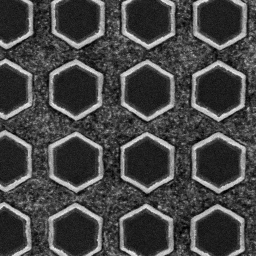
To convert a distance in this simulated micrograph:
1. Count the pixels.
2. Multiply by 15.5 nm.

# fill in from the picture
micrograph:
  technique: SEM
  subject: raised bodies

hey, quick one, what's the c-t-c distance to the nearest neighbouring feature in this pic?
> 1110 nanometers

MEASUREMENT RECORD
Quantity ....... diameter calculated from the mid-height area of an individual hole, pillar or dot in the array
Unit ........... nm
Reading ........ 810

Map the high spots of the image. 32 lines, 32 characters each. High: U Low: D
UUUUDDDUUUUUUDDDUUUUUDDDDUUUUUDD
UUUUDDDUUUUUUDDUUUUUUUDDUUUUUUUD
UUUUDDDUUUUUUDDDUUUUUUDDUUUUUUUD
UUUUDDDUUUUUUDDDUUUUUUDDUUUUUUUD
UUUDDDDUUUUUDDDDUUUUUDDDDUUUUUDD
UUDDDDDDDUDDDDDDDDUDDDDDDDUUUDDD
DDDDDDDDDDDDDDDDDDDDDDDDDDDDDDDD
DDDDDDDDDDDDDDDDDDDDDDDDDDDDDDDD
UUDDDDDDUUUDDDDDDUUUDDDDDDUUUDDD
UUUUDDUUUUUUDDDUUUUUUDDDUUUUUUDD
UUUUDDUUUUUUDDDUUUUUUUDDUUUUUUDD
UUUUDDUUUUUUDDDUUUUUUUDDUUUUUUDD
UUUUDDUUUUUUDDDUUUUUUUDDUUUUUUDD
UUUDDDDUUUUUDDDDUUUUUDDDDUUUUUDD
UDDDDDDDDUDDDDDDDDUDDDDDDDDUDDDD
DDDDDDDDDDDDDDDDDDDDDDDDDDDDDDDD
DDDDDDDDDDDDDDDDDDDDDDDDDDDDDDDD
UUDDDDDDUUUDDDDDDUUUDDDDDDUUUDDD
UUUUDDUUUUUUDDDUUUUUUDDDUUUUUUDD
UUUUDDUUUUUUUDDUUUUUUDDDUUUUUUDD
UUUUDDUUUUUUUDDUUUUUUUDDUUUUUUDD
UUUUDDUUUUUUUDDUUUUUUUDDUUUUUUDD
UUUDDDDUUUUUDDDDUUUUUDDDDUUUUUDD
UDDDDDDDDUDDDDDDDDUDDDDDDDDUDDDD
DDDDDDDDDDDDDDDDDDDDDDDDDDDDDDDD
DDDDDDDDDDDDDDDDDDDDDDDDDDDDDDDD
UUDDDDDDUUUDDDDDDUUUDDDDDDUUUDDD
UUUUDDUUUUUUDDDUUUUUUDDDUUUUUUDD
UUUUDDUUUUUUUDDUUUUUUDDDUUUUUUDD
UUUUDDUUUUUUUDDUUUUUUDDDUUUUUUDD
UUUUDDUUUUUUUDDUUUUUUDDDUUUUUUDD
UUUDDDDUUUUUDDDDUUUUUDDDDUUUUUDD